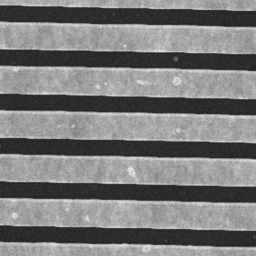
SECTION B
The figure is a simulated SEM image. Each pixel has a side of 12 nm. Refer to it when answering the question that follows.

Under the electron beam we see lines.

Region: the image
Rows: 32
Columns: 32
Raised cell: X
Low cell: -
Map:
XXXXXXXXXXXXXXXXXXXXXXXXXXXXXXXX
--------------------------------
--------------------------------
XXXXXXXXXXXXXXXXXXXXXXXXXXXXXXXX
XXXXXXXXXXXXXXXXXXXXXXXXXXXXXXXX
XXXXXXXXXXXXXXXXXXXXXXXXXXXXXXXX
-----------------------XXXXXXXXX
--------------------------------
XXXXXXXXXXXXXXXXX---------------
XXXXXXXXXXXXXXXXXXXXXXXXXXXXXXXX
XXXXXXXXXXXXXXXXXXXXXXXXXXXXXXXX
XXXXXXXXXXXXXXXXXXXXXXXXXXXXXXXX
--------------------------------
--------------------------------
XXXXXXXXXXXXXXXXXXXXXXXXXXXXXXXX
XXXXXXXXXXXXXXXXXXXXXXXXXXXXXXXX
XXXXXXXXXXXXXXXXXXXXXXXXXXXXXXXX
--------------------XXXXXXXXXXXX
--------------------------------
XXXXXXX-------------------------
XXXXXXXXXXXXXXXXXXXXXXXXXXXXXXXX
XXXXXXXXXXXXXXXXXXXXXXXXXXXXXXXX
XXXXXXXXXXXXXXXXXXXXXXXXXXXXXXXX
--------------------------------
--------------------------------
XXXXXXXXXXXXXXXXXXXXXXXXXXXXXXXX
XXXXXXXXXXXXXXXXXXXXXXXXXXXXXXXX
XXXXXXXXXXXXXXXXXXXXXXXXXXXXXXXX
-------------------XXXXXXXXXXXXX
--------------------------------
XXXXXXXXXXX---------------------
XXXXXXXXXXXXXXXXXXXXXXXXXXXXXXXX